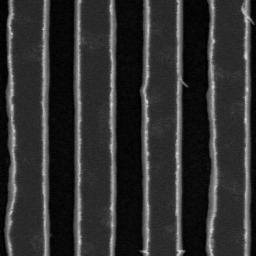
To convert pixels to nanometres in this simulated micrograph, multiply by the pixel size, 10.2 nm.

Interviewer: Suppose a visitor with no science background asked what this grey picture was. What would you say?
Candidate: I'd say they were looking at one or a few lines or trenches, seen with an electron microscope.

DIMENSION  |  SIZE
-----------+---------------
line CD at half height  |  379 nm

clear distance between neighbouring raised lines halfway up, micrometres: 0.309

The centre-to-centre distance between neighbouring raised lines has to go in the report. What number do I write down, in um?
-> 0.683